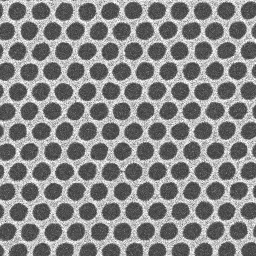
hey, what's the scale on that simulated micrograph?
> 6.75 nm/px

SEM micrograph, a regular array of holes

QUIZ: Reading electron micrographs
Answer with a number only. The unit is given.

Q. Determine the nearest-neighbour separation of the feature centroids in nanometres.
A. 153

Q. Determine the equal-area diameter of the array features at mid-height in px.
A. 17.9